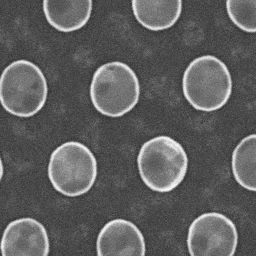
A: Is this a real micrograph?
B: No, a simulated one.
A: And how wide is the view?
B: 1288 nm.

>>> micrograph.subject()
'raised bodies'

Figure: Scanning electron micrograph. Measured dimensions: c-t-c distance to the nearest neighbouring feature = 446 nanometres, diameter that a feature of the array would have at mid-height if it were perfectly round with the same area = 246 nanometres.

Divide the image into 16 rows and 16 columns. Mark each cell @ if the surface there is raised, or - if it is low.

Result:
---@@@--@@@---@@
---@@----@@----@
----------------
----------------
@@----@@----@@--
@@@---@@@---@@--
@@@---@@----@@--
----------------
----------------
---@@----@@----@
---@@@---@@----@
---@@@---@@----@
----------------
-------------@--
@@@---@@@---@@@-
@@@---@@@---@@@-